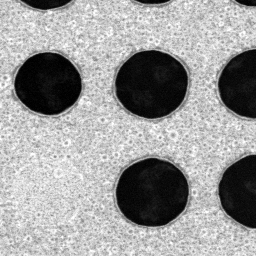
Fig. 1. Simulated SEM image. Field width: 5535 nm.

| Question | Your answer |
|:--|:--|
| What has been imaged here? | holes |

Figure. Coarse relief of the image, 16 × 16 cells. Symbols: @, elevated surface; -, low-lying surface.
@@--@@@@@@@@@@@@
@@@@@@@@@@@@@@@@
@@@@@@@@@@@@@@@@
@@--@@@@---@@@@-
@----@@-----@@--
@----@@-----@@--
@@---@@@---@@@--
@@@@@@@@@@@@@@@@
@@@@@@@@@@@@@@@@
@@@@@@@@@@@@@@@@
@@@@@@@@---@@@--
@@@@@@@-----@@--
@@@@@@@-----@@--
@@@@@@@@---@@@--
@@@@@@@@@@@@@@@@
@@@@@@@@@@@@@@@@